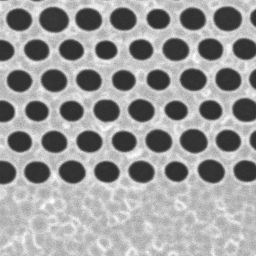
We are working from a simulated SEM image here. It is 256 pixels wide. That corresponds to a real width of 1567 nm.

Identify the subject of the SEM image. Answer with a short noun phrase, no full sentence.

a regular array of holes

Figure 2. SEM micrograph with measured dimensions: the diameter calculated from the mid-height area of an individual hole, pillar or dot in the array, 144 nm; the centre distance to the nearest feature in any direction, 0.212 µm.